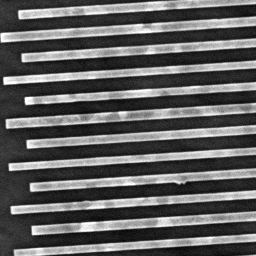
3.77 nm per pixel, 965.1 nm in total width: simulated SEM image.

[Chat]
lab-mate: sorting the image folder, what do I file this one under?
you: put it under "parallel lines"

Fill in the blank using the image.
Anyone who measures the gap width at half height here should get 51.7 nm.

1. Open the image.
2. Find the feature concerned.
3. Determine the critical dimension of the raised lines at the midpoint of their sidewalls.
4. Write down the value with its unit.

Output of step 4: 29.1 nanometres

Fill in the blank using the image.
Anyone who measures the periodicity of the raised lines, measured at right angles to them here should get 81.4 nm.